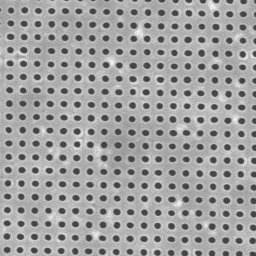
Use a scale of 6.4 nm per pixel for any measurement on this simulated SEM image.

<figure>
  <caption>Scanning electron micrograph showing a regular array of holes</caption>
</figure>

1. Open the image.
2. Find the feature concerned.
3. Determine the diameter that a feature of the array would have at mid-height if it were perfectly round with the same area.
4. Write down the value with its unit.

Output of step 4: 42.7 nanometers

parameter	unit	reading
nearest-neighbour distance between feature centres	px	13.1